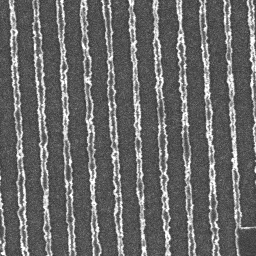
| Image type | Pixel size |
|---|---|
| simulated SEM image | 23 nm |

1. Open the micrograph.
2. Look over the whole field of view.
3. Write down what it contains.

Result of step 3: parallel lines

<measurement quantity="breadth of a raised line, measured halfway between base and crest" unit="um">0.127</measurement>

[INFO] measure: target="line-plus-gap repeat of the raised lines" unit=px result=23.8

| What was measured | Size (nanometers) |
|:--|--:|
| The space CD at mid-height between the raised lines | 420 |